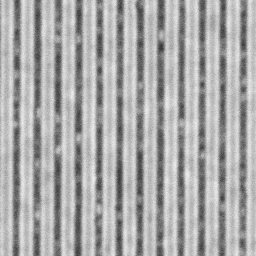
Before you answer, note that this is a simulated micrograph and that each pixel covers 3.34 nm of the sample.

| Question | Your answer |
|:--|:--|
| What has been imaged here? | parallel lines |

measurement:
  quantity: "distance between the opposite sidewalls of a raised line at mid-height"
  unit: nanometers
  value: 35.9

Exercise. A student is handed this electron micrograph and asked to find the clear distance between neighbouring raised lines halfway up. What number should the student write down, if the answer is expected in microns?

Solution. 0.0326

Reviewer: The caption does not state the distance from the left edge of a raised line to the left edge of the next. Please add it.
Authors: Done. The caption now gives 68.8 nm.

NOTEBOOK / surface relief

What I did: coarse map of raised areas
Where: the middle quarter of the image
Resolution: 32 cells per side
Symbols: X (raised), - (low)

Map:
XX---XX---XXX--XXX--XXX---XX---X
XX---XX---XXX--XXX--XXX---XX---X
XX---XXX--XXX--XXX--XXX---XX---X
XX---XX---XXX--XXX--XXX---XX---X
XX---XXX--XXX--XXX--XXX---XX---X
XX---XXX--XXX--XXX--XXX---XX---X
XX---XXX--XXX--XXX--XXX---XX---X
XX---XXX--XXX--XXX--XXX--XXX---X
XX---XXX--XXX--XXX--XXX--XXX---X
XX---XXX--XXX--XXX--XXX--XXX---X
XX---XX---XXX--XXX--XXX--XXX---X
XX---XX---XXX--XXX--XXX--XXX---X
XX---XX---XXX--XXX--XXX--XXX---X
XX---XX---XXX--XXX--XXX--XXX---X
XX---XX---XXX--XXX--XXX--XXX---X
XX---XX---XXX--XXX--XXX--XXX---X
XX---XX---XXX--XXX--XXX--XXX---X
XX---XX---XXX--XXX--XXX--XXX---X
XX-X-XX---XXX--XXX--XXX--XXX---X
XX---XXX--XXX--XXX--XXX--XXX---X
XX---XX---XXX--XXX--XXX--XXX---X
XX---XX---XXX--XXX--XXX--XXX---X
XX---XX---XXX--XXX--XXX--XXX---X
XX---XXX--XXX--XXX--XXX--XXX---X
XX---XXX--XXX--XXX--XXX--XXX---X
XX---XX---XXX--XXX--XXX--XXX---X
XX---XX---XXX--XXX--XXX--XXX---X
XX---XX---XXX--XXX--XXX--XXX---X
XX---XXX--XX---XXX--XXX--XXX---X
XX---XXX--XXX--XXX--XXX--XXX---X
XX---XX---XXX--XXX--XXX--XXX---X
XX---XX---XXX--XXX--XXX--XXX---X